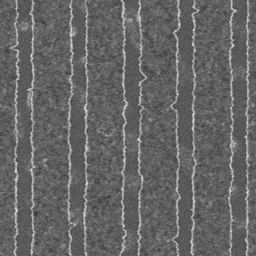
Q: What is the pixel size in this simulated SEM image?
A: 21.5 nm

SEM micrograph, parallel lines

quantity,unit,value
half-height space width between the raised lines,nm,339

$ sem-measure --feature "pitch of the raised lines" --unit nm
1150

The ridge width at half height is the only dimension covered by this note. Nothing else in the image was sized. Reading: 812 nm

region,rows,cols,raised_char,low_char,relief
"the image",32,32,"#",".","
##..#####..####..#####..#####..#
##..#####..####..#####..#####..#
##..#####..####..#####..#####..#
##..#####..####...####..#####..#
##..#####..#####..####..#####..#
##..#####..#####..####..#####..#
##..#####..#####..####..#####..#
##..#####..#####.#####..#####..#
##..#####..#####..####..#####..#
##..#####..####...####..#####..#
##..#####..####...####..#####..#
##..#####..#####..####..#####..#
##..#####..#####..####..#####..#
##..#####..#####..####..#####..#
##..#####..#####..####..#####..#
##..#####..#####..####..#####..#
##..#####..####...####..#####..#
##..#####..#####.#####..#####..#
##..#####..#####.#####..#####..#
##..#####..#####.#####..#####..#
##..#####..#####.#####..#####..#
##..#####..####..#####..#####..#
##..#####..####...####..#####..#
##..#####..####...####..#####..#
##..#####..####..#####..#####..#
##..#####..####..#####..#####..#
##..#####..####..#####..#####..#
##..#####..####..#####..#####..#
##..#####..####..#####..#####..#
##..#####..#####.#####..#####..#
##..#####..####..#####..#####..#
##..#####..####..#####..#####..#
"